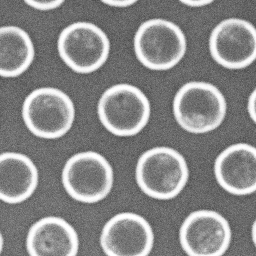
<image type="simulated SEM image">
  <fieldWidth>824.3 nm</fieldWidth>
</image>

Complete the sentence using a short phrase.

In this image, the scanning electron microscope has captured raised bodies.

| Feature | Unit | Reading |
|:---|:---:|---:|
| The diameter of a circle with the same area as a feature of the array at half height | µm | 0.155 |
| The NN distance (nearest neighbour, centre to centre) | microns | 0.239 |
